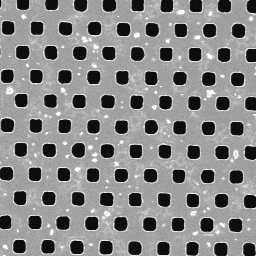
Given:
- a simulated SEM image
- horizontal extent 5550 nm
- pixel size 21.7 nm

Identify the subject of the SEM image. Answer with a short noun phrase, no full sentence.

a regular array of holes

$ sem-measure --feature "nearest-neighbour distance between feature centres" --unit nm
606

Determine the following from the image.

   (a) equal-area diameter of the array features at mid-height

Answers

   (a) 0.31 microns